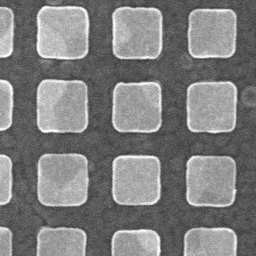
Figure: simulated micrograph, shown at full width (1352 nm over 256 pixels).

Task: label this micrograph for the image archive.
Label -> a regular array of raised bodies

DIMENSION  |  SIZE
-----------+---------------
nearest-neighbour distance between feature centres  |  388 nanometers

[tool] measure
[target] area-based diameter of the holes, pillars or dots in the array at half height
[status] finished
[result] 285 nm